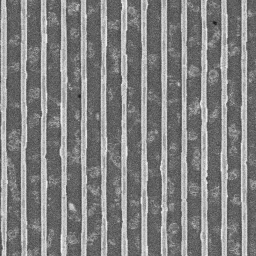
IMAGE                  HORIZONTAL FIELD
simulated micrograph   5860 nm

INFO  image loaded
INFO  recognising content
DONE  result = parallel lines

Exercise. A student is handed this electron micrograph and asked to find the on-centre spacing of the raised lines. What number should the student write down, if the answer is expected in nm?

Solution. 458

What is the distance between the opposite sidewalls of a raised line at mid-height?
0.1 microns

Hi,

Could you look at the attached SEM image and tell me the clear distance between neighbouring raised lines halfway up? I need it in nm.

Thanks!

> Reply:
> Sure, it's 364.